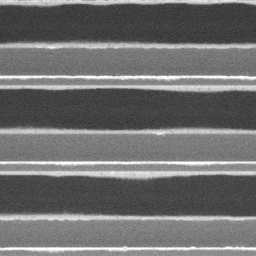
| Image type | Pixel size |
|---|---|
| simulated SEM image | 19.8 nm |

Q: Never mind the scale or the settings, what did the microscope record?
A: lines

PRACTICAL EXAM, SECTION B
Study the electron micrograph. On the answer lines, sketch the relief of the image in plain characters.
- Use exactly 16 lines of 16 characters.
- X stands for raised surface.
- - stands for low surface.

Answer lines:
----------------
----------------
----------------
XXXXXXXXXXXXXXXX
XXXXXXXXXXXXXXXX
----------------
----------------
----------------
XXXXXXXXXXXXXXXX
XXXXXXXXXXXXXXXX
XXXXXXXXXXXXXXXX
----------------
----------------
----------------
XXXXXXXXXXXXXXXX
XXXXXXXXXXXXXXXX